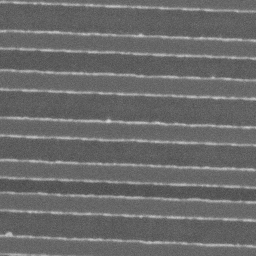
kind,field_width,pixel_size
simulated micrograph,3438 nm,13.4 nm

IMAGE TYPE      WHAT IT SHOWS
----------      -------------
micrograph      lines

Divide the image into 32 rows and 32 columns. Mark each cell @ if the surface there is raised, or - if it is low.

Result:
--------@@@@@@@@@@@@@@@@@@@@@@@@
--------------------------------
--------------------------------
--------------------------------
@@@@@@@@@@@@@@@@@@--------------
@@@@@@@@@@@@@@@@@@@@@@@@@@@@@@@@
-----------@@@@@@@@@@@@@@@@@@@@@
--------------------------------
--------------------------------
@@@@@@@@@@@@@@@@@@--------------
@@@@@@@@@@@@@@@@@@@@@@@@@@@@@@@@
--------@@@@@@@@@@@@@@@@@@@@@@@@
--------------------------------
--------------------------------
--------------------------------
@@@@@@@@@@@@@@@@@@@@@@@---------
@@@@@@@@@@@@@@@@@@@@@@@@@@@@@@@@
------------@@@@@@@@@@@@@@@@@@@@
--------------------------------
--------------------------------
@@@@@@@@@@@@@@------------------
@@@@@@@@@@@@@@@@@@@@@@@@@@@@@@@@
-------@@@@@@@@@@@@@@@@@@@@@@@@@
--------------------------------
@@@@@@@@@@@@--------------------
@@@@@@@@@@@@@@@@@@@@@@@@@@@@@@@@
---@@@@@@@@@@@@@@@@@@@@@@@@@@@@@
------------------------------@@
--------------------------------
@@------------------------------
@@@@@@@@@@@@@@@@@@@@@@@@--------
@@@@@@@@@@@@@@@@@@@@@@@@@@@@@@@@